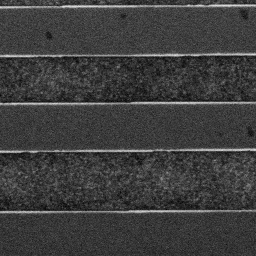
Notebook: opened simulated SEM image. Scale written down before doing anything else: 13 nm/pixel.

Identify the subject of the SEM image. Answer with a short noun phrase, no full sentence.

lines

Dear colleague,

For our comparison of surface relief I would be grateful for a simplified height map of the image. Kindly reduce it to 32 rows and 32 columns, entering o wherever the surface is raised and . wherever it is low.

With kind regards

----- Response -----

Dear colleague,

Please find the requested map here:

................................
oooooooooooooooooooooooooooooooo
oooooooooooooooooooooooooooooooo
oooooooooooooooooooooooooooooooo
oooooooooooooooooooooooooooooooo
oooooooooooooooooooooooooooooooo
oooooooooooooooooooooooooooooooo
................................
................................
................................
................................
................................
................................
oooooooooooooooooooooooooooooooo
oooooooooooooooooooooooooooooooo
oooooooooooooooooooooooooooooooo
oooooooooooooooooooooooooooooooo
oooooooooooooooooooooooooooooooo
oooooooooooooooooooooooooooooooo
................................
................................
................................
................................
................................
................................
................................
oooooooooooooooooooooooooooooooo
oooooooooooooooooooooooooooooooo
oooooooooooooooooooooooooooooooo
oooooooooooooooooooooooooooooooo
oooooooooooooooooooooooooooooooo
oooooooooooooooooooooooooooooooo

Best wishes